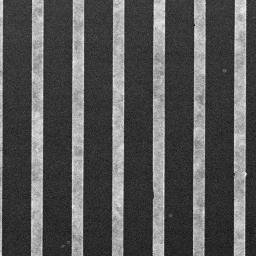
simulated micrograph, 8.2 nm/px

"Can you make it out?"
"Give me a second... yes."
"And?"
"parallel lines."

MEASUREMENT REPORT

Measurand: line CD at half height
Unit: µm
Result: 0.0871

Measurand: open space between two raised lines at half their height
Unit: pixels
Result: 30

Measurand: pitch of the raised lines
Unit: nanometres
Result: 332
